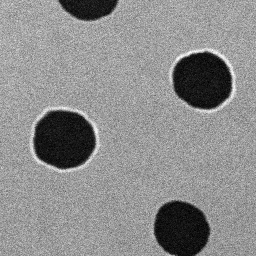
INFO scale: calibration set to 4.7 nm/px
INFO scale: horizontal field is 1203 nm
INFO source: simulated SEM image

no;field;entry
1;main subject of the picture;holes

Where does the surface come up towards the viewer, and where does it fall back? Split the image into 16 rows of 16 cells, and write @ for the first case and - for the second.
@@@@---@@@@@@@@@
@@@@@@@@@@@@@@@@
@@@@@@@@@@@@@@@@
@@@@@@@@@@@@--@@
@@@@@@@@@@@---@@
@@@@@@@@@@@---@@
@@@@@@@@@@@@--@@
@@@--@@@@@@@@@@@
@@----@@@@@@@@@@
@@----@@@@@@@@@@
@@@@@@@@@@@@@@@@
@@@@@@@@@@@@@@@@
@@@@@@@@@@@@@@@@
@@@@@@@@@@---@@@
@@@@@@@@@@---@@@
@@@@@@@@@@---@@@